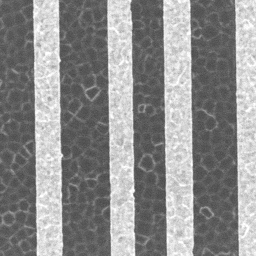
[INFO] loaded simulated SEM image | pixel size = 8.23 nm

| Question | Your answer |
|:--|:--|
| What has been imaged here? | one or a few lines or trenches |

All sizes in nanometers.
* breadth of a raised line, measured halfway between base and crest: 169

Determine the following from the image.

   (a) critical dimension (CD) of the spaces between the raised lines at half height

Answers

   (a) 382 nm